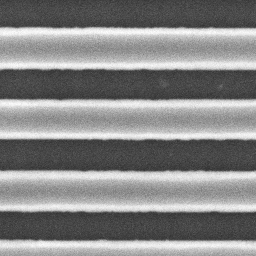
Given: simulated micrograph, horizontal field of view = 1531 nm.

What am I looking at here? lines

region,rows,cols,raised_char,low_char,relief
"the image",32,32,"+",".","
................................
................................
................................
................................
++++++++++++++++++++++++++++++++
++++++++++++++++++++++++++++++++
++++++++++++++++++++++++++++++++
++++++++++++++++++++++++++++++++
...............++..+............
................................
................................
................................
................................
++++++++++++++++++++++++++++++++
++++++++++++++++++++++++++++++++
++++++++++++++++++++++++++++++++
++++++++++++++++++++++++++++++++
................................
................................
................................
................................
................................
++++++++++++++++++++++++++++++++
++++++++++++++++++++++++++++++++
++++++++++++++++++++++++++++++++
++++++++++++++++++++++++++++++++
................................
................................
................................
................................
++++++++++++++++++++++++++++++++
++++++++++++++++++++++++++++++++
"